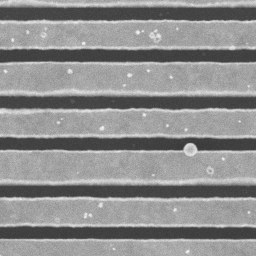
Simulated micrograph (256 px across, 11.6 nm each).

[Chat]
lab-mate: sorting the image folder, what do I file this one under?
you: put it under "lines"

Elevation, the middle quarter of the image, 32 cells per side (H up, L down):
HHHHHHHHHHHHHHHHHHHHHHHHHHHHHHHH
HHHHHHHHHHHHHHHHHHHHHHHHHHHHHHHH
HHHHHHHHHHHHHHHHHHHHHHHHHHHHHHHH
HHHHHHHHHHHHHHHHHHHHHHHHHHHHHHHH
HHHHHHHHHHHHHHHHHHHHHHHHHHHHHHHH
HHHHHHHHHHHHHHHHHHHHHHHHHHHHHHHH
HHHHHHHHHHHHHHHHHHHHHHHHHHHHHHHH
HHHHHHHHHHHHHHHHHHHHHHHHHHHHHHHH
LLLLLLLLLLLLLLLLLLLLLLLLLLLLLLLL
LLLLLLLLLLLLLLLLLLLLLLLLLLLLLLLL
LLLLLLLLLLLLLLLLLLLLLLLLLLLLLLLL
HHHHHHHHHHHHHHLHHHHHHHHHHHHLLHHH
HHHHHHHHHHHHHHHHHHHHHHHHHHHHHHHH
HHHHHHHHHHHHHHHHHHHHHHHHHHHHHHHH
HHHHHHHHHHHHHHHHHHHHHHHHHHHHHHHH
HHHHHHHHHHHHHHHHHHHHHHHHHHHHHHHH
HHHHHHHHHHHHHHHHHHHHHHHHHHHHHHHH
HHHHHHHHHHHHHHHHHHHHHHHHHHHHHHHH
LLLLLLLLHHLHLHLLLLLLLLLLLLHHHHLL
LLLLLLLLLLLLLLLLLLLLLLLLLLLLLLLL
LLLLLLLLLLLLLLLLLLLLLLLLLLLLLLHH
LLLLLLLLLLLLLLLLLLLLLLLLLLLLLLHH
HHHHHHHHHHHHHHHHHHHHHHHHHHHHHHHH
HHHHHHHHHHHHHHHHHHHHHHHHHHHHHHHH
HHHHHHHHHHHHHHHHHHHHHHHHHHHHHHHH
HHHHHHHHHHHHHHHHHHHHHHHHHHHHHHHH
HHHHHHHHHHHHHHHHHHHHHHHHHHHHHHHH
HHHHHHHHHHHHHHHHHHHHHHHHHHHHHHHH
HHHHHHHHHHHHHHHHHHHHHHHHHHHHHHHH
HHHHHHHHHHHHHHHHHHHHHHHHHHHHHHHH
LLLLLLLLLLLLLLLLLLLLLLLLLLLLLLLL
LLLLLLLLLLLLLLLLLLLLLLLLLLLLLLLL